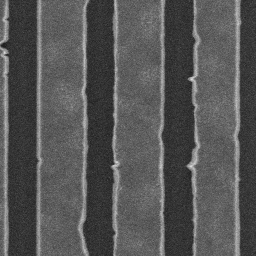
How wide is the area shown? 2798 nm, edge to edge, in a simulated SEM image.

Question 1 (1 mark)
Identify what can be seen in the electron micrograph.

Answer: one or a few lines or trenches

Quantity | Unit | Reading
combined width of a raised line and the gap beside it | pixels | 77.1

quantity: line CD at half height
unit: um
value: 0.505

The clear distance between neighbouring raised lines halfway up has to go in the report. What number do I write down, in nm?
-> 347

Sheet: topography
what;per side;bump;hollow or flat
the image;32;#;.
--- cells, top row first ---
#....######...######....######..
#....######...######....######..
#....######...######....######..
#....######...######....######..
#....######....#####.....#####..
.....######...######.....#####..
#....######...######....######..
#....######...######.....#####..
#....######...######....######..
#....######...######....######..
#....######...######....######..
#....######...######....######..
#....######...######....######..
#....######...######....######..
#....######...######....######..
#....######...######....######..
#....######...######....######..
#....######...######....######..
#....######...######....######..
#....######...######....######..
#....######...######....######..
#....######...######....######..
#....######...######....######..
#....######...######....######..
#....######...######....######..
#....######...######....######..
#....#####....######....######..
#....#####....######....######..
#....#####....######....######..
#....#####....######....######..
#....######...######....######..
#....######...######....######..